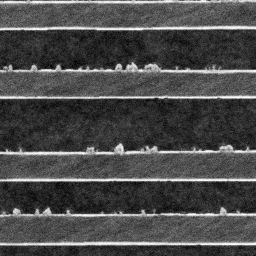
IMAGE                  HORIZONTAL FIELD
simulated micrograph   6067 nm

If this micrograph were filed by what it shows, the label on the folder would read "lines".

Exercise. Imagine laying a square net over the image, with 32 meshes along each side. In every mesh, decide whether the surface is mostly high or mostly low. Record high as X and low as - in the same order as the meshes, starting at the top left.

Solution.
XXXXXXXXXXXXXXXXXXXXXXXXXXXXXXXX
XXXXXXXXXXXXXXXXXXXXXXXXXXXXXXXX
XXXXXXXXXXXXXXXXXXXXXXXXXXXXXXXX
XXXXXXX----XXXXXXX--------------
--------------------------------
--------------------------------
--------------------------------
--------------------------------
--------------X-X-XX------------
XXXXXXXXXXXXXXXXXXXXXXXXXXXXXXXX
XXXXXXXXXXXXXXXXXXXXXXXXXXXXXXXX
XXXXXXXXXXXXXXXXXXXXXXXXXXXXXXXX
--------------------------------
--------------------------------
--------------------------------
--------------------------------
--------------------------------
--------------------------------
----------------------------X---
XXXXXXXXXXXXXXXXXXXXXXXXXXXXXXXX
XXXXXXXXXXXXXXXXXXXXXXXXXXXXXXXX
XXXXXXXXXXXXXXXXXXXXXXXXXXXXXXXX
--------------------------------
--------------------------------
--------------------------------
--------------------------------
---------------------------X----
XXXXXXXXXXXXXXXXXXXXXXXXXXXXXXXX
XXXXXXXXXXXXXXXXXXXXXXXXXXXXXXXX
XXXXXXXXXXXXXXXXXXXXXXXXXXXXXXXX
--------------------------------
--------------------------------